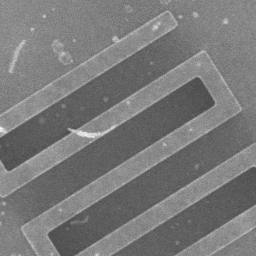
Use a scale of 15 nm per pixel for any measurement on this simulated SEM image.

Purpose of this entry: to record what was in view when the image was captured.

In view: groups of lines, slits or small figures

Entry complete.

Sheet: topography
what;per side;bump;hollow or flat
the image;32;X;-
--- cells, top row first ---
--------------------------------
--------------------------------
-------------------XXX----------
-----------------XXXXX----------
----------------XXXX------------
--------------XXXXX-------------
-------------XXXX--------X------
-----------XXXX--------XXX------
---------XXXXX--------XXXXX-----
--------XXXX--------XXXXXXXX----
------XXXXX--------XXXX---XX----
-----XXXX--------XXXX-----XXX---
---XXXX--------XXXXX-------XX---
--XXXX--------XXXX--------XXXX--
XXXX--------XXXXX--------XXXX---
XXX--------XXXX--------XXXXX----
X--------XXXX---------XXXX------
--------XXXX--------XXXX--------
------XXXX--------XXXXX--------X
----XXXXX--------XXXX--------XXX
---XXXX--------XXXXX--------XXXX
XXXXXX--------XXXX--------XXXXX-
XXXX--------XXXX--------XXXXX---
XX--------XXXXX--------XXXX-----
X--------XXXX--------XXXXX------
-------XXXXX--------XXXX--------
------XXXX--------XXXX---------X
----XXXXX--------XXXX--------XXX
---XXXX--------XXXX---------XXXX
---XXX-------XXXXX--------XXXX--
----XXX-----XXXX--------XXXX----
----XXX---XXXXX--------XXXX-----